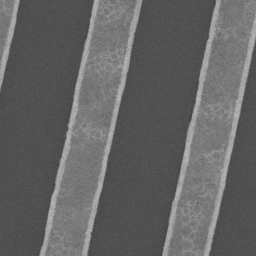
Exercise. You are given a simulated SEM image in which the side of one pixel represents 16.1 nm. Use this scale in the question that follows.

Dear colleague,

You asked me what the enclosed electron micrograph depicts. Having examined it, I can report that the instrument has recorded one or a few lines or trenches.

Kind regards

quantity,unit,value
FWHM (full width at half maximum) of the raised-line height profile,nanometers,664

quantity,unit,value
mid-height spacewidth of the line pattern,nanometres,1260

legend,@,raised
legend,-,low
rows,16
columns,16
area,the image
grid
@-----@@@-----@@
@-----@@-----@@@
@-----@@-----@@@
-----@@@-----@@@
-----@@@-----@@-
-----@@@-----@@-
-----@@-----@@@-
-----@@-----@@@-
----@@@-----@@@-
----@@@-----@@--
----@@-----@@@--
----@@-----@@@--
---@@@-----@@@--
---@@@-----@@---
---@@@-----@@---
---@@-----@@@---